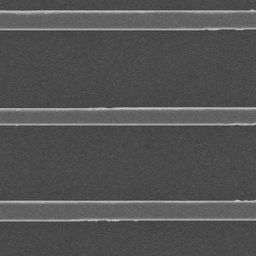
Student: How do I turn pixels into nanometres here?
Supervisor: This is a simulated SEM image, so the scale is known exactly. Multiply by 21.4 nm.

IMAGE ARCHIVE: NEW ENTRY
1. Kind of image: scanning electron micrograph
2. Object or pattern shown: lines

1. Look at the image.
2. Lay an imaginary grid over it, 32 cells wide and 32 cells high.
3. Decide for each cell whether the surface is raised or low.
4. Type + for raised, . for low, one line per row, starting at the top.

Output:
................................
++++++++++++++++++++++++++++++++
++++++++++++++++++++++++++++++++
++++++++++++++++++++++++++++++++
................................
................................
................................
................................
................................
................................
................................
................................
................................
.....................+++++++++++
++++++++++++++++++++++++++++++++
++++++++++++++++++++++++++++++++
................................
................................
................................
................................
................................
................................
................................
................................
................................
++++++++++++++++++++++++++++++++
++++++++++++++++++++++++++++++++
+++++++++++++++.................
................................
................................
................................
................................